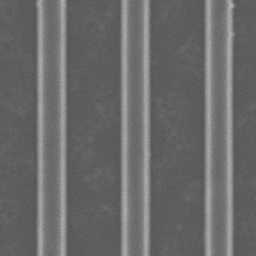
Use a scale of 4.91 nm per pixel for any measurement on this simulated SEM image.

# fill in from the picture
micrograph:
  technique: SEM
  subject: one or a few lines or trenches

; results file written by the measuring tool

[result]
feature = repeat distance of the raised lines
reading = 410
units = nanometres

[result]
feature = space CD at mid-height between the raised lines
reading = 291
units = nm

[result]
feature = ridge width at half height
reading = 120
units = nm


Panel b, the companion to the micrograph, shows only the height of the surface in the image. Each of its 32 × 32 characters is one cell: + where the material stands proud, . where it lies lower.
.....+++.......+++........+++...
.....+++.......+++........+++...
.....+++.......+++........+++...
.....+++.......+++........+++...
.....+++.......+++........+++...
.....+++.......+++........+++...
.....+++.......+++........+++...
.....+++.......+++........+++...
.....+++.......+++........+++...
.....+++.......+++........+++...
.....+++.......+++........+++...
.....+++.......+++........+++...
.....+++.......+++........+++...
.....+++.......+++........+++...
.....+++.......+++........+++...
.....+++.......+++........+++...
.....+++.......+++........+++...
.....+++.......+++........+++...
.....+++.......+++........+++...
.....+++.......++++.......+++...
.....+++.......+++........+++...
.....+++.......+++........+++...
.....+++.......+++........+++...
.....+++.......+++........+++...
.....+++.......+++........+++...
.....+++.......+++........+++...
.....+++.......+++........+++...
.....+++.......+++........+++...
.....+++.......+++........+++...
.....+++.......+++........+++...
.....+++.......+++........+++...
.....+++.......+++........+++...